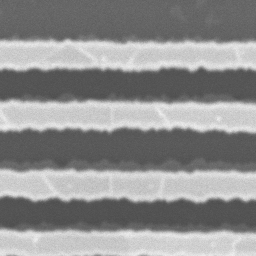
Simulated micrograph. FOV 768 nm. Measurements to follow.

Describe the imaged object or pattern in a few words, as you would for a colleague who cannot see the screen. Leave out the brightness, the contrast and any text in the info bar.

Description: lines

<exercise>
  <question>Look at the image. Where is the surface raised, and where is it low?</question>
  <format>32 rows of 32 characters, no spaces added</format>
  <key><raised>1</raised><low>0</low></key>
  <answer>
00000000000000000000000000000000
00000000000000000000000000000000
00000000000000000000000000000000
00000000000000000000000000000000
00000000000000000000000000000000
11111111111111111111111111101111
11111111111111111111111111111111
11111111111111111111111111111111
11111111111111111111101111111111
00000000000000000000000000000000
00000000000000000000000000000000
00000000000000000000000000000000
01000000000100000000000000000000
11111111111111111111111111111111
11111111111111111111111111111111
11111111111111111111111111111111
00000000000000000000000000001101
00000000000000000000000000000000
00000000000000000000000000000000
00000000000000000000000000000000
00000000000000000000000000000000
11011111111111110111101011111100
11111111111111111111111111111111
11111111111111111111111111111111
11111111111111111111111111111111
00000000000000000000000000000000
00000000000000000000000000000000
00000000000000000000000000000000
00000000000000000000000000000000
11111111111111111111111111111111
11111111111111111111111111111111
11111111111111111111111111111111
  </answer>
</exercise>